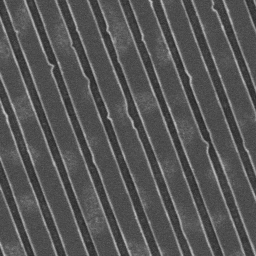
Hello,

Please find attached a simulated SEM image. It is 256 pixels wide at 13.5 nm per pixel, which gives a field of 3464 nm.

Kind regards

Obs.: parallel lines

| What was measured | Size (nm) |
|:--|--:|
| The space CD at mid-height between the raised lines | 116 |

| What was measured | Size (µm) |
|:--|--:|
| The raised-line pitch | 0.397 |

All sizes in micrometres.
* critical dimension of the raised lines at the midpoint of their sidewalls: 0.282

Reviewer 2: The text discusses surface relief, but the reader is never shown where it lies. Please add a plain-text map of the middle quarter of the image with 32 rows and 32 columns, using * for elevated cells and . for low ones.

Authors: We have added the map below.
****...*****..******..******..**
*****..******..*****...*****..**
*****...*****..******..******..*
******..*****..******..******..*
******..******..*****...*****...
******..******..******..******..
.*****...******..*****..******..
.******..******..******..*****..
..*****..******..******..******.
..******..******..******..*****.
..******..******..******..******
...*****...*****..******..******
*..******..*****...******..*****
*..******..******..******..*****
**..*****...*****...*****..*****
**..******..*****...******..****
**...*****..******..******..****
***..******..*****...*****...***
***..******..******..******..***
***...*****...*****..******..***
****..******..******..******..**
****..******..******..******..**
****...*****...*****...*****..**
*****..******..******..******..*
*****..******..******...*****..*
******..*****...*****...*****...
.*****...*****..******..******..
.*****...*****...*****...*****..
.******..******..*****...*****..
..*****...*****..******..******.
..*****...*****...*****...*****.
..******..******..******..*****.